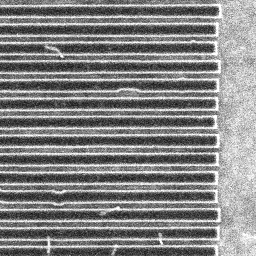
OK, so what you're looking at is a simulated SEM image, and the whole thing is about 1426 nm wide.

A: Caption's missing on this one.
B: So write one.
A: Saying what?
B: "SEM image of parallel lines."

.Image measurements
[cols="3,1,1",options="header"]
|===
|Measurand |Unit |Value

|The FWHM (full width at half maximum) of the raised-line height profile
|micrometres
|0.0682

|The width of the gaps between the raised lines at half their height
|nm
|34.8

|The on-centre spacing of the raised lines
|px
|18.5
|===